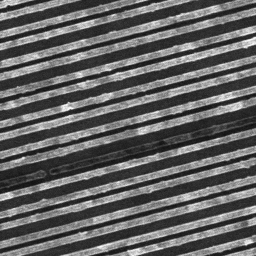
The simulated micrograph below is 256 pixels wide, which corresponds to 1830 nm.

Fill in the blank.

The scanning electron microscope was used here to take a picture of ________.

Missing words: parallel lines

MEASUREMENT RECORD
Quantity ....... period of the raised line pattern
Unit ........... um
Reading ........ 0.104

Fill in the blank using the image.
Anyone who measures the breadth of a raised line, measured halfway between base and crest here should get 45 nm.